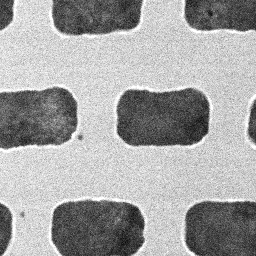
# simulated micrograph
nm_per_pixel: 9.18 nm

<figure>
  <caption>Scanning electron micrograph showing holes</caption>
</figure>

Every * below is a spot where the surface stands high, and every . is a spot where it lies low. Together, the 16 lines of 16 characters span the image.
.**......***....
.**......***....
****************
****************
****************
***.************
.....**......***
.....**......***
.....**......***
****************
****************
****************
****************
.**......***....
.**......***....
***......***....